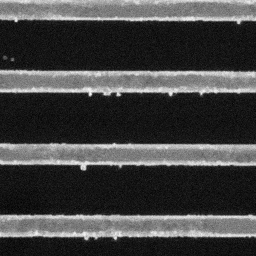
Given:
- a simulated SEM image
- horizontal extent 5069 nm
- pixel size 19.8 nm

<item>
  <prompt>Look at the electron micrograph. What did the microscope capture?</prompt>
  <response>lines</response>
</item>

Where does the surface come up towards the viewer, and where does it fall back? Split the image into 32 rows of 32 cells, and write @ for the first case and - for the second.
@@@@@@@@@@@@@@@@@@@@@@@@@@@@@@@@
@@@@@@@@@@@@@@@@@@@@@@@@@@@@@@@@
--------------------------------
--------------------------------
--------------------------------
--------------------------------
--------------------------------
--------------------------------
--------------------------------
@@@@@@@@@@@@@@@@@@@@@@@@@@@@@@@@
@@@@@@@@@@@@@@@@@@@@@@@@@@@@@@@@
--------------------------------
--------------------------------
--------------------------------
--------------------------------
--------------------------------
--------------------------------
--------------------------------
@@@@-@@@@@@@@@@@@@@@@@@@@@@@@@@@
@@@@@@@@@@@@@@@@@@@@@@@@@@@@@@@@
----------@---------------@@@@@@
--------------------------------
--------------------------------
--------------------------------
--------------------------------
--------------------------------
--------------------------------
@@@@@@@@@@@@@@@@@@@@@@@@@@@@@@@@
@@@@@@@@@@@@@@@@@@@@@@@@@@@@@@@@
--------------------------------
--------------------------------
--------------------------------